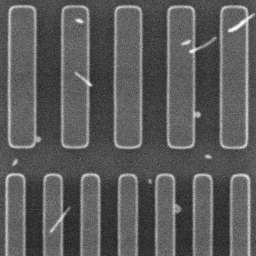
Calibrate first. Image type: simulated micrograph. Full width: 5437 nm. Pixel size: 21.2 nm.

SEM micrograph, groups of lines, slits or small figures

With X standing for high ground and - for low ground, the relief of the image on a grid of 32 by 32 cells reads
--------------------------------
-XXX----XXX---XXXX---XXX----XXX-
-XXX----XXX---XXXX---XXX----XXX-
-XXX----XXX---XXXX---XXX----XXX-
-XXX----XXX---XXXX---XXX----XXX-
-XXX----XXX---XXXX---XXX----XXX-
-XXX----XXX---XXXX---XXX----XXX-
-XXX----XXX---XXXX---XXX----XXX-
-XXX----XXX---XXXX---XXX----XXX-
-XXX----XXX---XXXX---XXX----XXX-
-XXX----XXX---XXXX---XXX----XXX-
-XXX----XXX---XXXX---XXX----XXX-
-XXX----XXX---XXXX---XXX----XXX-
-XXX----XXX---XXXX---XXX----XXX-
-XXX----XXX---XXXX---XXX----XXX-
-XXX----XXX---XXXX---XXX----XXX-
-XXX----XXX---XXXX---XXX----XXX-
-XXX----XXX---XXXX---XXX----XXX-
--------------------------------
--------------------------------
--------------------------------
--------------------------------
-XX---XX--XX---XX---XX--XX---XX-
-XX---XX--XX---XX--XXX--XX---XX-
-XX--XXX--XX---XX--XXX--XX---XX-
-XX--XXX--XX---XX--XXX--XX---XX-
-XX--XXX--XX---XX--XXX--XX---XX-
-XX--XXX--XX---XX--XXX--XX---XX-
-XX--XXX--XX---XX--XXX--XX---XX-
-XX--XXX--XX---XX--XXX--XX---XX-
-XX--XXX--XX---XX--XXX--XX---XX-
-XX--XXX--XX---XX--XXX--XX---XX-